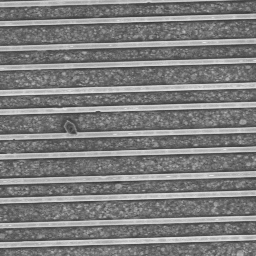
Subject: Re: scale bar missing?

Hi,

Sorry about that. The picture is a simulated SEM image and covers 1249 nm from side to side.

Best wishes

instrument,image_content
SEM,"parallel lines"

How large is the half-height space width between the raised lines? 73.1 nm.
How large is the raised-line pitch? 108 nm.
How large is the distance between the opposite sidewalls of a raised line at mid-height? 23.1 nm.